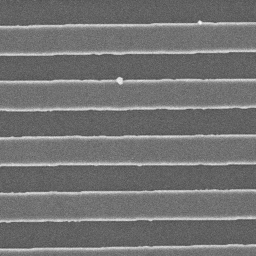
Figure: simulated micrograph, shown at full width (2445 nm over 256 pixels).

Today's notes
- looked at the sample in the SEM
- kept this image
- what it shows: lines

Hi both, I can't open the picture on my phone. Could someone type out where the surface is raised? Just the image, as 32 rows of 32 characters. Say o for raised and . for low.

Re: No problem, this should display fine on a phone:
................................
................................
................................
oooooooooooooooooooooooooooooooo
oooooooooooooooooooooooooooooooo
oooooooooooooooooooooooooooooooo
ooooooooooooooooooooooooooo.....
................................
................................
................................
oooooooooooooooooooooooooooooooo
oooooooooooooooooooooooooooooooo
oooooooooooooooooooooooooooooooo
ooooooooooooooooooooooooooooo.o.
................................
................................
................................
oooooooooooooooooooooooooooooooo
oooooooooooooooooooooooooooooooo
oooooooooooooooooooooooooooooooo
oooooooooooooooooooooooo..oo....
................................
................................
................................
oooooooooooooooooooooooooooooooo
oooooooooooooooooooooooooooooooo
oooooooooooooooooooooooooooooooo
ooooooooooooooooo...............
................................
................................
................................
oooooooooooooooooooooooooooooooo